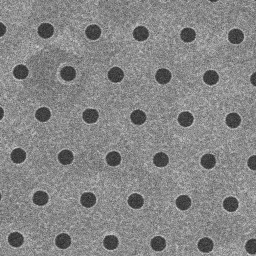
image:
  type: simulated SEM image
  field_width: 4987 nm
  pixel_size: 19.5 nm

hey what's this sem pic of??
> a regular array of holes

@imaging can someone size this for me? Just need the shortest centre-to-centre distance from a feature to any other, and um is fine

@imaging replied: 0.924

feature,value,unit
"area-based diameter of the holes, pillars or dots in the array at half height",330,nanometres